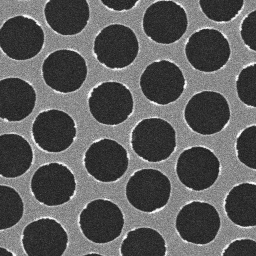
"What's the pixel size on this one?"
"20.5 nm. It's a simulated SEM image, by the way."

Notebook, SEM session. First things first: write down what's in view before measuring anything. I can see a regular array of holes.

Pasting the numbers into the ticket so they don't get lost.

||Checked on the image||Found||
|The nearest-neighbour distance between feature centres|1110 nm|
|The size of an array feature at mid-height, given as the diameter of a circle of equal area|44.1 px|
